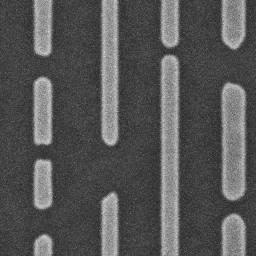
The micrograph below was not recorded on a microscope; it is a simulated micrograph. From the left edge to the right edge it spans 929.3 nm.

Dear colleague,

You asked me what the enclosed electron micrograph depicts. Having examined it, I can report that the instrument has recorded one or a few lines or trenches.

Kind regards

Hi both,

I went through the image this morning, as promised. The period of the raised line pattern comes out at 229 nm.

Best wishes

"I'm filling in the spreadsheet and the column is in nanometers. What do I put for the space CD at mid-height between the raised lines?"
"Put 168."